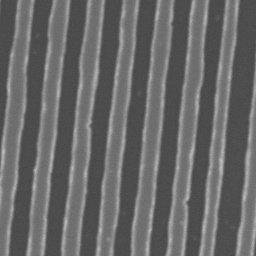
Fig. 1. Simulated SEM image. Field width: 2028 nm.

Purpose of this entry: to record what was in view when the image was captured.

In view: parallel lines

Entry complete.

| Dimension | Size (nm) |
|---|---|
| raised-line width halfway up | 132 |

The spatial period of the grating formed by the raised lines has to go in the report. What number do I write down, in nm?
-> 272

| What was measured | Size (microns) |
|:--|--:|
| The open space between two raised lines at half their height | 0.14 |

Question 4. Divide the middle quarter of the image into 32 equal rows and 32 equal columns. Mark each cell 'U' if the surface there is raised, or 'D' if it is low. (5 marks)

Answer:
DDDDUUUUDDDDDUUUUDDDDDUUUUDDDDDU
DDDDUUUUDDDDDUUUUDDDDUUUUUDDDDUU
DDDDUUUUDDDDDUUUUDDDDUUUUUDDDDUU
DDDDUUUUDDDDDUUUUDDDDUUUUDDDDDUU
DDDDUUUUDDDDDUUUUDDDDUUUUDDDDDUU
DDDDUUUUDDDDDUUUUDDDDUUUUDDDDDUU
DDDDUUUDDDDDDUUUUDDDDUUUUDDDDDUU
DDDDUUUUDDDDUUUUDDDDDUUUUDDDDDUU
DDDUUUUDDDDDUUUUDDDDDUUUUDDDDDUU
DDDUUUUDDDDDUUUUDDDDDUUUUDDDDUUU
DDDUUUUDDDDDUUUUDDDDDUUUUDDDDUUU
DDDUUUUDDDDDUUUUDDDDDUUUUDDDDUUU
DDDUUUUDDDDDUUUUDDDDDUUUUDDDDUUU
DDDUUUUDDDDUUUUUDDDDUUUUUDDDDUUU
DDDUUUUDDDDUUUUDDDDDUUUUUDDDDUUU
DDDUUUDDDDDUUUUDDDDDUUUUDDDDDUUU
DDDUUUDDDDDUUUUDDDDDUUUUDDDDDUUU
DDDUUUUDDDDUUUUDDDDDUUUUDDDDDUUU
DDDUUUDDDDDUUUUDDDDDUUUUDDDDDUUU
DDDUUUUDDDDUUUUDDDDDUUUUDDDDDUUU
DDUUUUUDDDDUUUUDDDDDUUUUDDDDDUUU
DDUUUUDDDDDUUUUDDDDDUUUUDDDDUUUU
DDUUUUUDDDUUUUUDDDDDUUUUDDDDUUUU
DDUUUUDDDDDUUUUDDDDDUUUUDDDDUUUU
DDUUUUDDDDUUUUDDDDDDUUUDDDDDUUUU
DDUUUUDDDDUUUUDDDDDUUUUDDDDDUUUU
DDUUUUDDDDUUUUDDDDDUUUUDDDDDUUUU
DDUUUUDDDDUUUUDDDDDUUUUDDDDDUUUU
DUUUUUDDDDUUUUDDDDDUUUUDDDDDUUUU
DUUUUUDDDDUUUUDDDDDUUUUDDDDDUUUD
DUUUUUDDDDUUUUDDDDDUUUUDDDDUUUUD
DUUUUUDDDDUUUUDDDDDUUUUDDDDUUUUD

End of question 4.